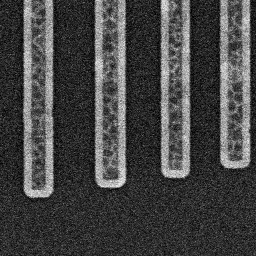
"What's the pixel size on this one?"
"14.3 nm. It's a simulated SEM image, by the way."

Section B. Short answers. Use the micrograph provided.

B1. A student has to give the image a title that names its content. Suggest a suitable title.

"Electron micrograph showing one or a few lines or trenches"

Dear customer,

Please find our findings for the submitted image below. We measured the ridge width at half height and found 0.317 micrometres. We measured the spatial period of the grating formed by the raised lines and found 0.942 microns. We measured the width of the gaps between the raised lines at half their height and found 0.622 micrometres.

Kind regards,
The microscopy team